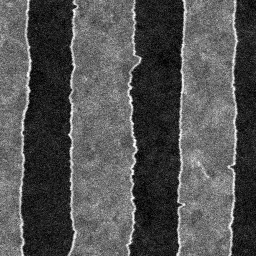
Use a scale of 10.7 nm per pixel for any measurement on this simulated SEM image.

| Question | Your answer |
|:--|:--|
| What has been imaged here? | one or a few lines or trenches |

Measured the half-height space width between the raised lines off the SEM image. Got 513 nanometres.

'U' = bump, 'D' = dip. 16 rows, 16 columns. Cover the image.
UUDDDUUUDDDDUUUD
UUDDDUUUDDDUUUUD
UUDDDUUUDDDUUUUD
UUDDDUUUUDDUUUUD
UUDDDUUUDDDUUUUD
UUDDUUUUDDDUUUUD
UUDDUUUUDDDUUUUD
UDDDUUUUDDDUUUUD
UDDDUUUUDDDUUUUD
UDDDUUUUDDDUUUUD
UDDDUUUUDDDUUUUD
UDDDUUUUDDDUUUUD
UDDDUUUUDDDUUUUD
UDDDUUUUDDDUUUUD
UDDDDUUUDDDUUUDD
UDDDUUUUDDDUUUDD